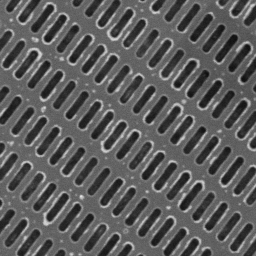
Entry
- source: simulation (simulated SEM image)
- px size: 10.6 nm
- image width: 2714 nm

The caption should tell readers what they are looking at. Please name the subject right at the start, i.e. a regular array of holes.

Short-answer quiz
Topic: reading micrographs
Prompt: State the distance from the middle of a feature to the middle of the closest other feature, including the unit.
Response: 171 nanometers